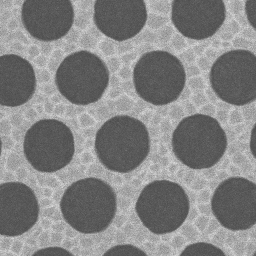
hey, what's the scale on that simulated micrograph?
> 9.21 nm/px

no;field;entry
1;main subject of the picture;holes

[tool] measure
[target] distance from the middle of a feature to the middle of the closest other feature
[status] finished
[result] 0.678 µm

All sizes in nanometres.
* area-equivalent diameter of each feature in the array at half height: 497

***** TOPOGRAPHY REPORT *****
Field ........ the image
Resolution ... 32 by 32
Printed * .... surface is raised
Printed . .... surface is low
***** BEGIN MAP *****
***......***......****......***.
***......***......***.......***.
***......***......****......***.
***......***......****.....*****
****....*****....******...******
********************************
**********.*******...********..*
...*****.....****.....*****.....
....***......****......***......
....***.......***......***......
....***......****......***......
....****.....****......****.....
....*****...******....******....
********************************
***************.********..******
****....*****.....****.....*****
***......***......****......***.
***......***.......***......***.
***......***.......***......***.
***......***......****......****
****.....****.....*****....*****
*****.*********.****************
**********...***************...*
....****......****.....****.....
....****......***......****.....
.....***.......**.......**......
.....***......***.......***.....
.....***......****.....****.....
....*****....*****....******...*
*.******************************
************************..******
****.....****.....*****.....****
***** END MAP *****